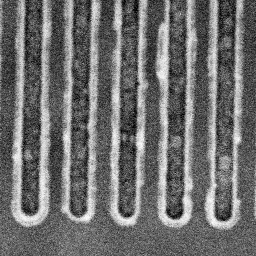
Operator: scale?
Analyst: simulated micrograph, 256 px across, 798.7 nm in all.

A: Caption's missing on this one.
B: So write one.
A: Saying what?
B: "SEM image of parallel lines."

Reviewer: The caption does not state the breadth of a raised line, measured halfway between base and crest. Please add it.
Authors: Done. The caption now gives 0.0877 microns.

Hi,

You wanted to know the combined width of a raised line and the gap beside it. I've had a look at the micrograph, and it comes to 48.2 pixels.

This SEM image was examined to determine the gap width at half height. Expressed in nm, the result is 65.1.